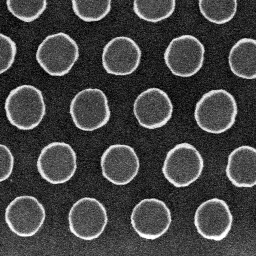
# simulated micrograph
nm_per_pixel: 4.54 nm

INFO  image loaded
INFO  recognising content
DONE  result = a regular array of raised bodies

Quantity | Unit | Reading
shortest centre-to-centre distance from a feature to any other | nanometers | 280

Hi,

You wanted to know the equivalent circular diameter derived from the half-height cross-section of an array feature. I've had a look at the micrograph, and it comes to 39.4 pixels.